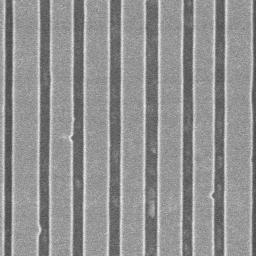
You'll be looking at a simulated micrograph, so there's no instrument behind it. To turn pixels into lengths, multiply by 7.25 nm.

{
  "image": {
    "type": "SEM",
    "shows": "parallel lines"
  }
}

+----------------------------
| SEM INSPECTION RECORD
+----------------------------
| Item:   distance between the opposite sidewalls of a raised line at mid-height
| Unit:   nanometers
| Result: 179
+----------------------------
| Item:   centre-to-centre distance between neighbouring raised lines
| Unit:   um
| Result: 0.257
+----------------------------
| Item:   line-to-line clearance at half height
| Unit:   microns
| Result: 0.0788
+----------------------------